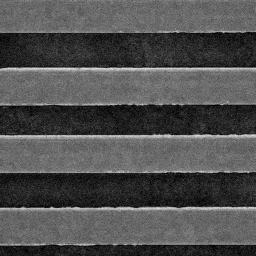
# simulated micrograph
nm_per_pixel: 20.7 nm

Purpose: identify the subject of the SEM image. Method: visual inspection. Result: lines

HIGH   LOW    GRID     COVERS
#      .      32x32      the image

################################
################################
################################
################################
................................
................................
................................
................................
................................
################################
################################
################################
################################
................................
................................
................................
................................
################################
################################
################################
################################
################################
................................
................................
................................
................................
################################
################################
################################
################################
######.#.###..#.#...............
................................